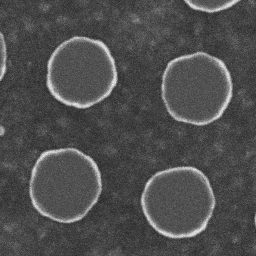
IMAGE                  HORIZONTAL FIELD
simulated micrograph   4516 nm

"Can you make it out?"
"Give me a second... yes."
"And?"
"raised bodies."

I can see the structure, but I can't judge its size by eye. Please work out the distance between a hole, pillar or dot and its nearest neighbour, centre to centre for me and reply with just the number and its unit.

2.02 µm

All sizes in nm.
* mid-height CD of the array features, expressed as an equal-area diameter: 1250